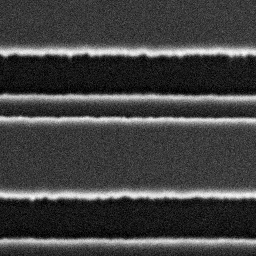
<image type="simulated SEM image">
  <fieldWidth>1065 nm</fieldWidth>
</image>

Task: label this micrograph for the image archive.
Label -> lines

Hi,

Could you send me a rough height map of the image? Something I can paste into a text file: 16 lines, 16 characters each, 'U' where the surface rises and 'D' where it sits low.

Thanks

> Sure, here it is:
UUUUUUUUUUUUUUUU
UUUUUUUUUUUUUUUU
UUUUUUUUUUUUUUUU
DDDDDDDDDDDDDDDD
DDDDDDDDDDDDDDDD
DDDDDDDDDDDDDDDD
UUUUUUUUUUUUUUUU
UUUUUUUUUUUUUUUU
UUUUUUUUUUUUUUUU
UUUUUUUUUUUUUUUU
UUUUUUUUUUUUUUUU
UUUUUUUUUUUUUUUU
DDDDDDDDDDDDDDDD
DDDDDDDDDDDDDDDD
DDDDDDDDDDDDDDDD
UUUUUUUUUUUUUUUU